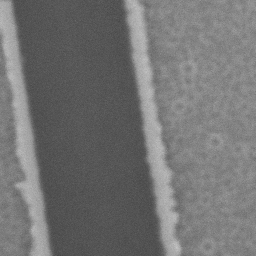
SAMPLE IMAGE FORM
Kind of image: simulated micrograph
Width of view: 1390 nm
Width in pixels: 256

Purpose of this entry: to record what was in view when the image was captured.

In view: one or a few lines or trenches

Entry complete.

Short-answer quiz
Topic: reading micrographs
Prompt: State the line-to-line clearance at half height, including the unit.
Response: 675 nanometers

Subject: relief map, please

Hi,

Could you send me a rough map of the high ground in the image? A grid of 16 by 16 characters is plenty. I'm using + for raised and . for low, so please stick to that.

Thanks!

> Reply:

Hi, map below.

........++++++++
+.......++++++++
+........+++++++
+........+++++++
+........+++++++
+........+++++++
+........+++++++
+........+++++++
++.......+++++++
++........++++++
++........++++++
++........++++++
++........++++++
++........++++++
+++.......++++++
+++........+++++